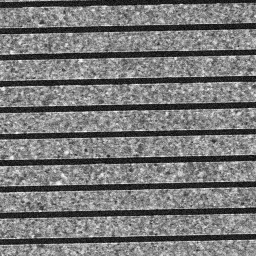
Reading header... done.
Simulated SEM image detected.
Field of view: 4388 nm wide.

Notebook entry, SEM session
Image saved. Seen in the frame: parallel lines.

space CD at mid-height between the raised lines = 118 nanometers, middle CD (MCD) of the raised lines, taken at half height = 0.341 micrometres